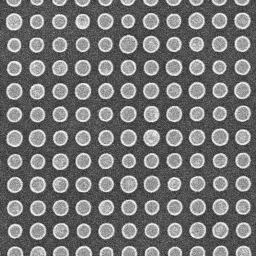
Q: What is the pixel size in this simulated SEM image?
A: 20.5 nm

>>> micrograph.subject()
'a regular array of raised bodies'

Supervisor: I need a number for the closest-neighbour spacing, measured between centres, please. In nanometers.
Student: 465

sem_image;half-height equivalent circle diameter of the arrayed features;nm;303